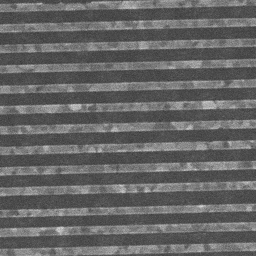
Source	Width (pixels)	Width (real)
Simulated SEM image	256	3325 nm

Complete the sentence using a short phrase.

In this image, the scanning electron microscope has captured parallel lines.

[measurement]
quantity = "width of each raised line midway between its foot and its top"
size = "0.0893 um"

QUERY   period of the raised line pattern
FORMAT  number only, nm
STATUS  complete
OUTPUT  265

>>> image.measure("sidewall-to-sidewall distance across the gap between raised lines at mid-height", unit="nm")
177